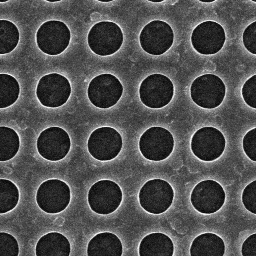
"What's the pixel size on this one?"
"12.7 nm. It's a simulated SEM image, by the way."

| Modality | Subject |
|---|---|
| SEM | a regular array of holes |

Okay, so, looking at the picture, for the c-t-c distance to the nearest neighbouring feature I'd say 655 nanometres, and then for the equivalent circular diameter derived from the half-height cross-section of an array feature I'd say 0.445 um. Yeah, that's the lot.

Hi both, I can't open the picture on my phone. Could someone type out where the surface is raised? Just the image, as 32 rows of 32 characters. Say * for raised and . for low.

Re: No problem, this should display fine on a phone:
********************************
********************************
.******************.************
..***....**....***...***....***.
..**.....**....**.....**....**..
..***....**....***....**....**..
.****...****..****...****..****.
********************************
********************************
.*****..****..*****..****..*****
..***....**....***....**....**..
..**.....**....**.....**....**..
..***...***....***...***....**..
*******************.*****..****.
********************************
********************************
..***...****...***...***....***.
..***....**....**.....**....**..
..***....**....**.....**....**..
..***...****...***...***....***.
********************************
********************************
.*****.************.************
..***....**....***....**....***.
..***....**....**.....**....**..
..***....**....***...***....**..
.*****..****..*****..****..****.
********************************
********************************
..***...****...***...****..****.
..***....**....**.....**....**..
..**.....**....**.....**....**..